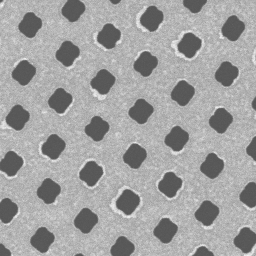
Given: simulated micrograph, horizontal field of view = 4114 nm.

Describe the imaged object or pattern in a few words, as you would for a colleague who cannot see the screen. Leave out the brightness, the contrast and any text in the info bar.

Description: a regular array of holes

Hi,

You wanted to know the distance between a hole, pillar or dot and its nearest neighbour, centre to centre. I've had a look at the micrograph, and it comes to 0.732 um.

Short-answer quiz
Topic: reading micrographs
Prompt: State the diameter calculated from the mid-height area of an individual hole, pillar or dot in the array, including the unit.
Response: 378 nm